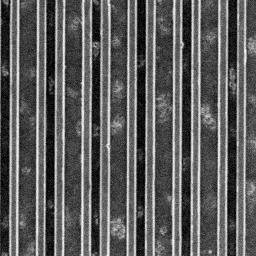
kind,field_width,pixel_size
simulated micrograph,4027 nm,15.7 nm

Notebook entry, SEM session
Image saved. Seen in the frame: parallel lines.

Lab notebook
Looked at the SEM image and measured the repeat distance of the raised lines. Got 357 nm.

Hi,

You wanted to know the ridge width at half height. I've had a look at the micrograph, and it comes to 124 nanometres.